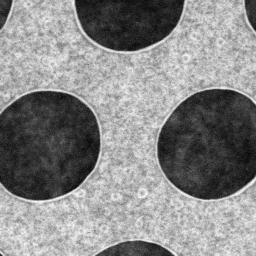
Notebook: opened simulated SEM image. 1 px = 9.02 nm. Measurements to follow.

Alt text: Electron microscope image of holes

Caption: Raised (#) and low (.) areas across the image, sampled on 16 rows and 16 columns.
.####......####.
#####......#####
######....######
################
################
################
#....######.....
......####......
......####......
......####......
......####......
.....######.....
##.#############
################
################
#######...######